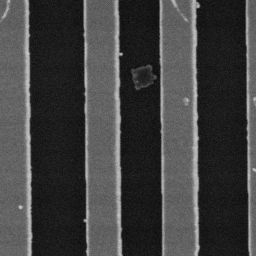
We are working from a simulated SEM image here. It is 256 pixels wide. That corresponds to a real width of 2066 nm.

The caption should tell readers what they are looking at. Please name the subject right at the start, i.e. lines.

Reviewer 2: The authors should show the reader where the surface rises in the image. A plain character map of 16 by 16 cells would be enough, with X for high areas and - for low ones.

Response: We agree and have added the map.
XX---XX---XX---X
XX---XX---XX---X
XX---XX---XX---X
XX---XX---XX---X
XX---XX---XX---X
XX---XX---XX---X
XX---XX---XX---X
XX---XX---XX---X
XX---XX---XX---X
XX---XX---XX----
XX---XXX--XX----
XX---XXX--XX----
XX---XXX--XX----
XX---XXX--XX----
XX---XXX--XX----
XX---XXX--XX----